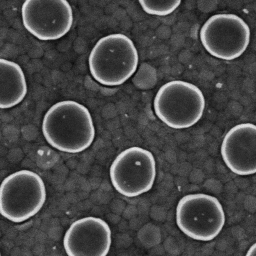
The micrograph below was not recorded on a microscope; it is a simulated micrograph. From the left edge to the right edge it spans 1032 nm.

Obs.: raised bodies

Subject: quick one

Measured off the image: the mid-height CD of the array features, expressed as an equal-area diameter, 184 nm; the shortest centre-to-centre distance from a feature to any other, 321 nm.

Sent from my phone